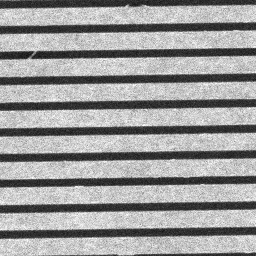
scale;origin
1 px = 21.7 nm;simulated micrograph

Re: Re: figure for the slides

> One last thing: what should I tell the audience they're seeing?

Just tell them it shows parallel lines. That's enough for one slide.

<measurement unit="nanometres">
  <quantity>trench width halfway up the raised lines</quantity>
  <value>147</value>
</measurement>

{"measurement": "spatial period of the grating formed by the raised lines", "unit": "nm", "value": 556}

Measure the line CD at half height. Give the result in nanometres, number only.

402